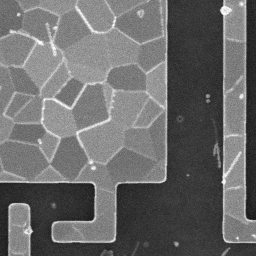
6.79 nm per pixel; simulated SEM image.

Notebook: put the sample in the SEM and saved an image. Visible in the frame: wiring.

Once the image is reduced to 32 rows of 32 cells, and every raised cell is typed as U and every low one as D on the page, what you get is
UUUUUUUUUUUUUUUUUUUUUDDDDDDDUUUD
UUUUUUUUUUUUUUUUUUUUUDDDDDDDUUUD
UUUUUUUUUUUUUUUUUUUUUDDDDDDDUUUD
UUUUUUUUUUUUUUUUUUUUUDDDDDDDUUUD
UUUUUUUUUUUUUUUUUUUUUDDDDDDDUUUD
UUUUUUUUUUUUUUUUUUUUUDDDDDDDUUUD
UUUUUUUUUUUUUUUUUUUUUDDDDDDDUUUD
UUUUUUUUUUUUUUUUUUUUUDDDDDDDUUUD
UUUUUUUUUUUUUUUUUUUUUDDDDDDDUUUD
UUUUUUUUUUUUUUUUUUUUUDDDDDDDUUUD
UUUUUUUUUUUUUUUUUUUUUDDDDDDDUUUD
UUUUUUUUUUUUUUUUUUUUUDDDDDDDUUUD
UUUUUUUUUUUUUUUUUUUUUDDDDDDDUUUD
UUUUUUUUUUUUUUUUUUUUUDDDDDDDUUUD
UUUUUUUUUUUUUUUUUUUUUDDDDDDDUUUD
UUUUUUUUUUUUUUUUUUUUUDDDDDDDUUUD
UUUUUUUUUUUUUUUUUUUUUDDDDDDDUUUD
UUUUUUUUUUUUUUUUUUUUUDDDDDDDUUUD
UUUUUUUUUUUUUUUUUUUUUDDDDDDDUUUD
UUUUUUUUUUUUUUUUUUUUUDDDDDDDUUUD
UUUUUUUUUUUUUUUUUUUUUDDDDDDDUUUD
UUUUUUUUUUUUUUUUUUUUUDDDDDDDUUUD
UUUUUUUUUUUUUUUUUUUUUDDDDDDDUUUD
DDDDDDDDDDDDUUUDDDDDDDDDDDDDUUUD
DDDDDDDDDDDDUUDDDDDDDDDDDDDDUUUD
DDDDDDDDDDDDUUDDDDDDDDDDDDDDUUUD
DUUUDDDDDDDDUUDDDDDDDDDDDDDDUUUD
DUUUDDDDDDDDUUDDDDDDDDDDDDDDUUUU
DUUUDDDUUUUUUUDDDDDDDDDDDDDDUUUU
DUUUDDDUUUUUUUDDDDDDDDDDDDDDUUUU
DUUUDDDDDDDDDDDDDDDDDDDDDDDDDDDD
DUUUDDDDDDDDDDDDDDDDDDDDDDDDDDDD